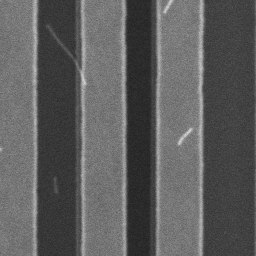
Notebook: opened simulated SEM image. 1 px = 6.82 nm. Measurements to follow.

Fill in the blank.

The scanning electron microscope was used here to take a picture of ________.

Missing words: lines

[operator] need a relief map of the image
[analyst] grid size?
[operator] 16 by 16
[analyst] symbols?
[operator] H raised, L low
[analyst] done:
HHLLLHHHLLHHHLLL
HHLLLHHHLLHHHLLL
HHLLLHHHLLHHHLLL
HHLLLHHHLLHHHLLL
HHLLLHHHLLHHHLLL
HHLLLHHHLLHHHLLL
HHLLLHHHLLHHHLLL
HHLLLHHHLLHHHLLL
HHLLLHHHLLHHHLLL
HHLLLHHHLLHHHLLL
HHLLLHHHLLHHHLLL
HHLLLHHHLLHHHLLL
HHLLLHHHLLHHHLLL
HHLLLHHHLLHHHLLL
HHLLLHHHLLHHHLLL
HHLLLHHHLLHHHLLL